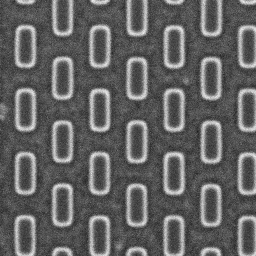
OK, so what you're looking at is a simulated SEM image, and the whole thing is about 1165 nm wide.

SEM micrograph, groups of lines, slits or small figures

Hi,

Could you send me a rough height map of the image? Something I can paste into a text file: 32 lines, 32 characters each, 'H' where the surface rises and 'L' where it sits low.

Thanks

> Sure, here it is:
LLLLLLLHHLLLLLLLHHLLLLLLLHHHLLLL
LLLLLLLHHLLLLLLLHHLLLLLLLHHHLLLL
LLLLLLLHHLLLLLLLHHLLLLLLLHHHLLLL
LLHHLLLHHLLLHLLLHHLLLHHLLHHHLLHH
LLHHLLLLLLLHHHLLLLLLLHHLLLLLLLHH
LLHHLLLLLLLHHHLLLLLLLHHLLLLLLLHH
LLHHLLLLLLLHHHLLLLLLLHHLLLLLLLHH
LLHHLLLHHLLHHHLLHHLLLHHLLLHLLLHH
LLLLLLLHHLLLLLLLHHLLLLLLLHHLLLLL
LLLLLLLHHLLLLLLLHHLLLLLLLHHLLLLL
LLLLLLLHHLLLLLLLHHLLLLLLLHHLLLLL
LLHHLLLHHLLLHLLLHHLLLHHLLHHLLLHH
LLHHLLLLLLLHHHLLLLLLLHHLLLLLLLHH
LLHHLLLLLLLHHHLLLLLLLHHLLLLLLLHH
LLHHLLLLLLLHHHLLLLLLLHHLLLLLLLHH
LLHHLLLHHLLHHHLLHHLLLHHLLLHLLLHH
LLLLLLLHHLLLLLLLHHLLLLLLLHHLLLLL
LLLLLLLHHLLLLLLLHHLLLLLLLHHLLLLL
LLLLLLLHHLLLLLLLHHLLLLLLLHHHLLLL
LLHHLLLHHLLHHLLLHHLLLHHLLHHLLLHH
LLHHLLLLLLLHHHLLLLLLLHHLLLLLLLHH
LLHHLLLLLLLHHHLLLLLLLHHLLLLLLLHH
LLHHLLLLLLLHHHLLLLLLLHHLLLLLLLHH
LLHHLLLHHLLHHHLLHHLLLHHLLHHLLLHH
LLLLLLLHHLLLLLLLHHLLLLLLLHHLLLLL
LLLLLLLHHLLLLLLLHHLLLLLLLHHLLLLL
LLLLLLLHHLLLLLLLHHLLLLLLLHHLLLLL
LLHHLLLHHLLHHLLLHHLLLHHLLHHLLLHH
LLHHLLLLLLLHHHLLLLLLLHHLLLLLLLHH
LLHHLLLLLLLHHHLLLLLLLHHLLLLLLLHH
LLHHLLLLLLLHHHLLLLLLLHHLLLLLLLHH
LLHHLLLHHLLHHHLLHHLLLHHLLHHLLLHH